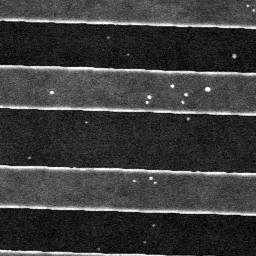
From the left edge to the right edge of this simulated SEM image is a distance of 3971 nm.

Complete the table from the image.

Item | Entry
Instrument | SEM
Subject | lines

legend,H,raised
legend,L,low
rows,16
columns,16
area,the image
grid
HHHHHHHHHHHHHHHH
LLLLLLLHHHHHHHHH
LLLLLLLLLLLLLLLL
LLLLLLLLLLLLLLLL
HHHHHHHHHHHHLLLL
HHHHHHHHHHHHHHHH
HHHHHHHHHHHHHHHH
LLLLLLLLLLLLLLLL
LLLLLLLLLLLLLLLL
LLLLLLLLLLLLLLLL
HHHHHLLLLLLLLLLL
HHHHHHHHHHHHHHHH
HHHHHHHHHHHHHHHH
LLLLLLLLLLLLLLLL
LLLLLLLLLLLLLLLL
LLLLLLLLLLLLLLLL